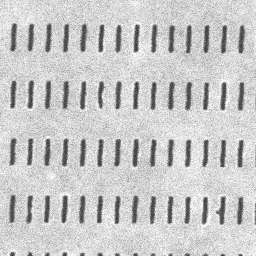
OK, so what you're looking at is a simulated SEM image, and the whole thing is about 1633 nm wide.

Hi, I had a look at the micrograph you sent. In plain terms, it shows a regular array of holes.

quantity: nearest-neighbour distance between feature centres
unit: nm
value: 109